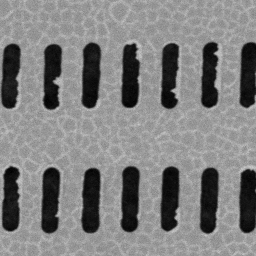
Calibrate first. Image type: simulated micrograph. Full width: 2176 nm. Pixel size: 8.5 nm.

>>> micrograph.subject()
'a regular array of holes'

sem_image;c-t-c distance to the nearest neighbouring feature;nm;334